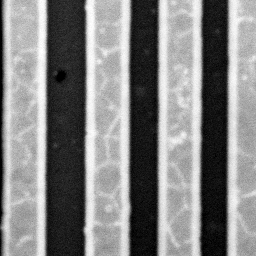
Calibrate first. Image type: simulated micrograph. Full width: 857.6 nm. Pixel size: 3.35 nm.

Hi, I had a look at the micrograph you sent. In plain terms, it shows one or a few lines or trenches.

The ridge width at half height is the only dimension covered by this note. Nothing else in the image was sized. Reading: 0.121 um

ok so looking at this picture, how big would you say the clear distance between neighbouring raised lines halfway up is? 121 nm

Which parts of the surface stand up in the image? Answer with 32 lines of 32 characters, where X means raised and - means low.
-XXXX------XXXXX----XXXXX----XXX
-XXXX------XXXXX----XXXXX----XXX
-XXXX------XXXXX----XXXXX----XXX
-XXXX------XXXXX----XXXXX----XXX
-XXXX------XXXXX----XXXXX----XXX
-XXXX------XXXXX----XXXXX----XXX
-XXXX------XXXXX----XXXXX----XXX
-XXXX------XXXXX----XXXXX----XXX
-XXXX------XXXXX----XXXXX----XXX
-XXXX------XXXXX----XXXXX----XXX
-XXXX------XXXXX----XXXXX----XXX
-XXXX------XXXXX----XXXXX----XXX
-XXXX------XXXXX----XXXXX----XXX
-XXXX------XXXXX----XXXXX----XXX
-XXXX------XXXXX----XXXXX----XXX
-XXXX------XXXXX----XXXXX----XXX
-XXXX------XXXXX----XXXXX----XXX
-XXXX------XXXXX----XXXXX----XXX
-XXXX------XXXXX----XXXXX----XXX
-XXXX------XXXXX----XXXXX----XXX
-XXXX------XXXXX----XXXXX----XXX
-XXXX------XXXXX----XXXXX----XXX
-XXXX------XXXXX----XXXXX----XXX
-XXXX------XXXXX----XXXXX----XXX
-XXXX------XXXXX----XXXXX----XXX
-XXXX------XXXXX----XXXXX----XXX
-XXXX------XXXXX----XXXXX----XXX
-XXXX------XXXXX----XXXXX----XXX
XXXXX------XXXXX----XXXXX----XXX
-XXXX------XXXXX----XXXXX----XXX
-XXXX------XXXXX----XXXXX----XXX
-XXXX------XXXXX----XXXXX----XXX